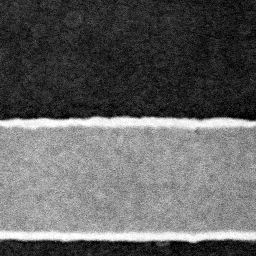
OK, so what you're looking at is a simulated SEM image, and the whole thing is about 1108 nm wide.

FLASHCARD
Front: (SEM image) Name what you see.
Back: one or a few lines or trenches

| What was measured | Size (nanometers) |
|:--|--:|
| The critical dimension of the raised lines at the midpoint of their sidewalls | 491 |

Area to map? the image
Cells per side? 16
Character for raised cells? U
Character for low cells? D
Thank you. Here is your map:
DDDDDDDDDDDDDDDD
DDDDDDDDDDDDDDDD
DDDDDDDDDDDDDDDD
DDDDDDDDDDDDDDDD
DDDDDDDDDDDDDDDD
DDDDDDDDDDDDDDDD
DDDDDDDDDDDDDDDD
DDDDDDDDDDDDDDDD
UUUUUUUUUUUUUUUU
UUUUUUUUUUUUUUUU
UUUUUUUUUUUUUUUU
UUUUUUUUUUUUUUUU
UUUUUUUUUUUUUUUU
UUUUUUUUUUUUUUUU
UUUUUUUUUUUUUUUU
DDDDDDDDDDDDDDDD